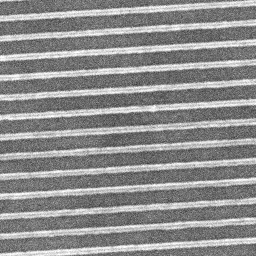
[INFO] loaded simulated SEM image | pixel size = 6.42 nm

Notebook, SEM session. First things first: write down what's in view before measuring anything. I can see parallel lines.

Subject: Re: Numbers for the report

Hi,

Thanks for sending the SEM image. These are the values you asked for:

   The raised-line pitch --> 19.8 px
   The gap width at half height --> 15.1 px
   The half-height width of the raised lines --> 0.0296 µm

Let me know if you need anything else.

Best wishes